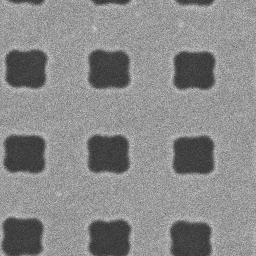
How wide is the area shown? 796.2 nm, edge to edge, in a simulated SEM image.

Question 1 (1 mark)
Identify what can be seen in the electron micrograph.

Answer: holes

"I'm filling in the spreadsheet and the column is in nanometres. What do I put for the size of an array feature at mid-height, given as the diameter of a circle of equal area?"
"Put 132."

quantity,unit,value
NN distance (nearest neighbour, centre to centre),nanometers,260